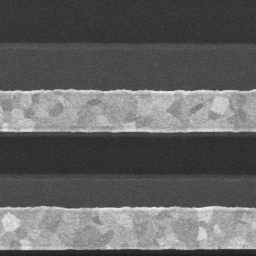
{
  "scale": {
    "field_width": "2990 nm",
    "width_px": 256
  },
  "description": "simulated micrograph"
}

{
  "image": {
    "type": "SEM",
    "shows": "lines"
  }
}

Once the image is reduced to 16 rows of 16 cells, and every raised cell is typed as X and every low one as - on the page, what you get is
----------------
----------------
----------------
XXXXXXXXXXXXXXXX
XXXXXXXXXXXXXXXX
XXXXXXXXXXXXXXXX
XXXXXXXXXXXXXXXX
XXXXXXXXXXXXXXXX
----------------
----------------
----------------
XXXXXXXXXXXXXXXX
XXXXXXXXXXXXXXXX
XXXXXXXXXXXXXXXX
XXXXXXXXXXXXXXXX
XXXXXXXXXXXXXXXX